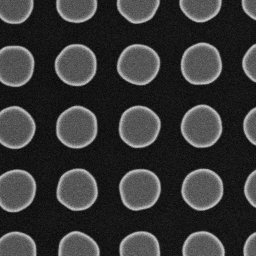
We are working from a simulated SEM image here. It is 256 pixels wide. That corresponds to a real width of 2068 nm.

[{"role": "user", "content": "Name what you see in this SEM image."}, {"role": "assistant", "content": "an array of small figures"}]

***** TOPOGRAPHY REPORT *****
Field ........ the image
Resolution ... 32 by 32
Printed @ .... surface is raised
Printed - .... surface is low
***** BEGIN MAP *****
@@@@---@@@@@---@@@@@---@@@@@--@@
@@@@---@@@@@---@@@@----@@@@----@
@@@-----@@@-----@@@-----@@------
--------------------------------
--------------------------------
------------------------@@------
@@@@----@@@@---@@@@----@@@@----@
@@@@---@@@@@---@@@@@---@@@@@--@@
@@@@---@@@@@---@@@@@---@@@@@--@@
@@@@---@@@@@---@@@@----@@@@----@
-@@-----@@@------@------@@------
--------------------------------
--------------------------------
-@@------@@-----@@------@@------
@@@@---@@@@@---@@@@@---@@@@----@
@@@@---@@@@@---@@@@@---@@@@@---@
@@@@---@@@@@---@@@@@---@@@@@---@
@@@@---@@@@@---@@@@----@@@@----@
-@@------@----------------------
--------------------------------
--------------------------------
-@@-----@@@-----@@@-----@@@-----
@@@@---@@@@@---@@@@@---@@@@@---@
@@@@---@@@@@---@@@@@---@@@@@---@
@@@@---@@@@@---@@@@@---@@@@@---@
@@@@----@@@@---@@@@----@@@@----@
--------------------------------
--------------------------------
--------------------------------
@@@@----@@@-----@@@-----@@@----@
@@@@---@@@@@---@@@@@---@@@@@---@
@@@@---@@@@@---@@@@@---@@@@@---@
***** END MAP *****